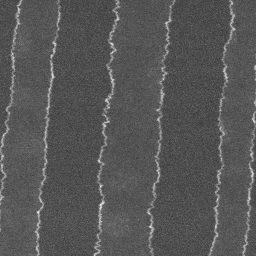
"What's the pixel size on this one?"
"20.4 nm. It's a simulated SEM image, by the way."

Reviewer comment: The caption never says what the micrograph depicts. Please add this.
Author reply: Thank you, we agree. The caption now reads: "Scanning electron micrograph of one or a few lines or trenches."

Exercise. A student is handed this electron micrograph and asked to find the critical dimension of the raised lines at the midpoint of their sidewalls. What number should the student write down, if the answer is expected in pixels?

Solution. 60.3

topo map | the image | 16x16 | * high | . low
*...***....***..
*...***...*****.
*..****...****..
*..****...****..
*..****...****..
*..****...****..
*..****...****..
...****...****..
...****...****..
...***....****..
...***....****..
...***....****..
...***....****..
..****...*****..
..****...*****.*
..****...****..*